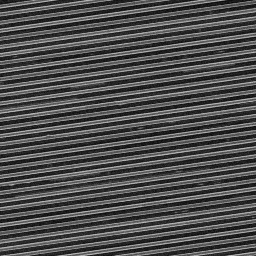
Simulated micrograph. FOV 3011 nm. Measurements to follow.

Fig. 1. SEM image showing parallel lines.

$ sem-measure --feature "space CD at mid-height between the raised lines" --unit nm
53.8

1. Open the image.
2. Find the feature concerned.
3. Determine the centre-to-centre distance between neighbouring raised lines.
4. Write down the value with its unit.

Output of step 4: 0.0944 µm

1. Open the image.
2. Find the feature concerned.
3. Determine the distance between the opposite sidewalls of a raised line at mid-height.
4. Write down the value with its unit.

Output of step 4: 43.7 nm